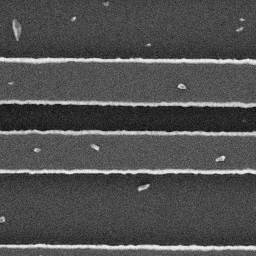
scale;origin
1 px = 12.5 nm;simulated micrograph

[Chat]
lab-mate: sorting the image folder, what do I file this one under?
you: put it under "lines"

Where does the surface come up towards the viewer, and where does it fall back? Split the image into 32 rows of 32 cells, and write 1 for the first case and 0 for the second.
00000000000000000000000000000000
00000000000000000000000000000000
00000000000000000000000000000000
00000000000000000000000000000000
00000000000000000000000000000000
00000000000000000000000000000000
00000000000000000000000000000000
11110111111111111101101100000000
11111111111111111111111111111111
11111111111111111111111111111111
11111111111111111111111111111111
11111111111111111111111111111111
11111111111111111111111111111111
00000000000000000000000000000000
00000000000000000000000000000000
00000000000000000000000000000000
11111111111110110110000000000000
11111111111111111111111111111111
11111111111111111111111111111111
11111111111111111111111111111111
11111111111111111111111111111111
01111110110011011111111011111111
00000000000000000000000000000000
00000000000000000000000000000000
00000000000000000000000000000000
00000000000000000000000000000000
00000000000000000000000000000000
00000000000000000000000000000000
00000000000000000000000000000000
00000000000000000000000000000000
00000000000000000000000000000000
11111111111111111111111111111111